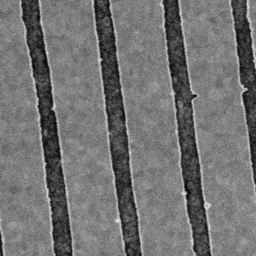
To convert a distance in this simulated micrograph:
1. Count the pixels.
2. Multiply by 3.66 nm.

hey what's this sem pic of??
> one or a few lines or trenches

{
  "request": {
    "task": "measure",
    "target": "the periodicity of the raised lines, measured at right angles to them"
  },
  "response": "252 nanometers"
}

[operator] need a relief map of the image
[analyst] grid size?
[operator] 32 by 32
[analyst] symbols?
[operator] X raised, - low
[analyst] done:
XXX--XXXXXXX--XXXXXX--XXXXXXX--X
XXX--XXXXXXX--XXXXXX--XXXXXXX--X
XXX--XXXXXXX--XXXXXXX--XXXXXX--X
XXX--XXXXXXX--XXXXXXX--XXXXXX--X
XXX--XXXXXXX--XXXXXXX--XXXXXX--X
XXX---XXXXXX---XXXXXX--XXXXXX---
XXXX--XXXXXX---XXXXXX--XXXXXXX--
XXXX--XXXXXXX--XXXXXX--XXXXXXX--
XXXX--XXXXXXX--XXXXXX--XXXXXXX--
XXXX--XXXXXXX--XXXXXX---XXXXXX--
XXXX--XXXXXXX--XXXXXX---XXXXXX--
XXXX---XXXXXX--XXXXXXX--XXXXXX--
XXXXX--XXXXXX--XXXXXXX--XXXXXX--
XXXXX--XXXXXX---XXXXXX--XXXXXXX-
XXXXX--XXXXXX---XXXXXX--XXXXXXX-
XXXXX--XXXXXX---XXXXXX--XXXXXXX-
XXXXX--XXXXXXX--XXXXXX--XXXXXXX-
XXXXX--XXXXXXX--XXXXXX---XXXXXX-
XXXXX---XXXXXX--XXXXXX---XXXXXX-
XXXXX---XXXXXX--XXXXXXX--XXXXXX-
XXXXXX--XXXXXX--XXXXXXX--XXXXXX-
XXXXXX--XXXXXX--XXXXXXX--XXXXXXX
XXXXXX--XXXXXX--XXXXXXX--XXXXXXX
XXXXXX--XXXXXX---XXXXXX--XXXXXXX
XXXXXX--XXXXXXX--XXXXXX--XXXXXXX
XXXXXX--XXXXXXX--XXXXXX---XXXXXX
XXXXXX---XXXXXX--XXXXXX---XXXXXX
XXXXXX---XXXXXX--XXXXXXX--XXXXXX
XXXXXX---XXXXXX--XXXXXXX--XXXXXX
XXXXXX---XXXXXX---XXXXXX--XXXXXX
XXXXXXX--XXXXXX---XXXXXX--XXXXXX
XXXXXXX--XXXXXXX--XXXXXX--XXXXXX